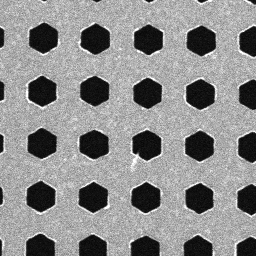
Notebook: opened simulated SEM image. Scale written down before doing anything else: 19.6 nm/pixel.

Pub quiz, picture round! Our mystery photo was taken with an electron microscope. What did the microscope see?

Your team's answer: a regular array of holes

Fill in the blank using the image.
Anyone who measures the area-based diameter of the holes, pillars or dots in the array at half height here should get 0.583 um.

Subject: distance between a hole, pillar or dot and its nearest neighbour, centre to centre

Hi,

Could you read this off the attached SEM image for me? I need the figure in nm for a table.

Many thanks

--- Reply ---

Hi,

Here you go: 1020